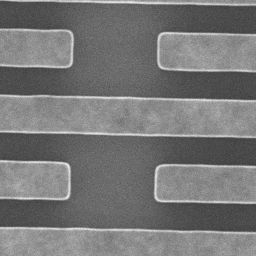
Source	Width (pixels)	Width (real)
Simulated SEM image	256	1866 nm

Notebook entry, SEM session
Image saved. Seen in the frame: groups of lines, slits or small figures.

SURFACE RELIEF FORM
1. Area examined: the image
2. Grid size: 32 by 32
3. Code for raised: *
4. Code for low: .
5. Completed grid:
........................********
................................
................................
................................
*********...........************
*********...........************
*********...........************
*********...........************
....................************
................................
................................
................................
**************************......
********************************
********************************
********************************
...*****************************
................................
................................
................................
********........................
*********...........************
*********..........*************
*********..........*************
*********..........*************
................................
................................
................................
*****...........................
********************************
********************************
********************************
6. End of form